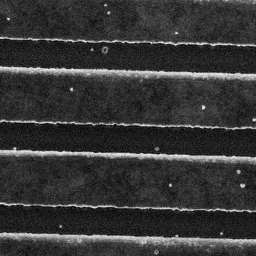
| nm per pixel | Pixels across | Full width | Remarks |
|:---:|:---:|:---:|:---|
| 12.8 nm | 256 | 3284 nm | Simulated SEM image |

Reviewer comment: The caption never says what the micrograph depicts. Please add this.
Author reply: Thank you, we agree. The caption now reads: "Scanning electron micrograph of lines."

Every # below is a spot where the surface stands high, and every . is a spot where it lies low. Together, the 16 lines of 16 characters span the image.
################
################
....############
................
######..........
################
################
################
................
.#..............
################
################
################
................
................
################